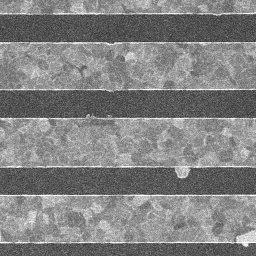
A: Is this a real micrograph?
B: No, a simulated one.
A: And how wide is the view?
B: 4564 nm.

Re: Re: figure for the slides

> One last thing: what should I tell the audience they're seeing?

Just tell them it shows one or a few lines or trenches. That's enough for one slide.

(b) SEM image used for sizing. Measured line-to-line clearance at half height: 0.504 µm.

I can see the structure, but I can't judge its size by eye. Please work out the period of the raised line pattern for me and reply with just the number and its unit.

1360 nm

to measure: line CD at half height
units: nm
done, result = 854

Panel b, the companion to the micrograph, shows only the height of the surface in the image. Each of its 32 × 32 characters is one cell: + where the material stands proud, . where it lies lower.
++++++++++++++++++++++++++++++++
++++++++++++++++++++++++++++++++
................................
................................
................................
++++++++++++++++++++++++++++++++
++++++++++++++++++++++++++++++++
++++++++++++++++++++++++++++++++
++++++++++++++++++++++++++++++++
++++++++++++++++++++++++++++++++
++++++++++++++++++++++++++++++++
................................
................................
................................
...........+....................
++++++++++++++++++++++++++++++++
++++++++++++++++++++++++++++++++
++++++++++++++++++++++++++++++++
++++++++++++++++++++++++++++++++
++++++++++++++++++++++++++++++++
++++++++++++++++++++++++++++++++
................................
................................
................................
++++++++++++++++++++++++++++++++
++++++++++++++++++++++++++++++++
++++++++++++++++++++++++++++++++
++++++++++++++++++++++++++++++++
++++++++++++++++++++++++++++++++
++++++++++++++++++++++++++++++++
................................
................................